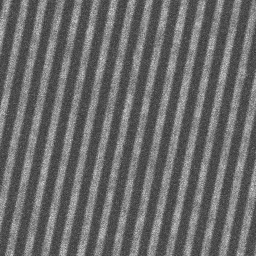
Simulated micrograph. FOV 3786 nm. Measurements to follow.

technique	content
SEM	parallel lines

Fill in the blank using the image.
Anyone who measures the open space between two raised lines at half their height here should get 174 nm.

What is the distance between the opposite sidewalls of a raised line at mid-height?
0.0797 µm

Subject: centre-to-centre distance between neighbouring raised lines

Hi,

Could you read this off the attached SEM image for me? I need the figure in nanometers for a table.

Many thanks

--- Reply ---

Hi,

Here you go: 257